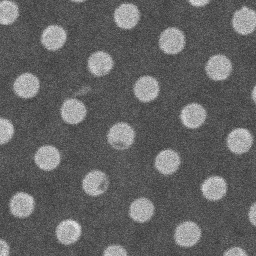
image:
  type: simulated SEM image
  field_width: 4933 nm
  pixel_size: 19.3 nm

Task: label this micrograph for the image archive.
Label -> a regular array of raised bodies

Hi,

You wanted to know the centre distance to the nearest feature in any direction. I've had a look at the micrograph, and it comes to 53.1 pixels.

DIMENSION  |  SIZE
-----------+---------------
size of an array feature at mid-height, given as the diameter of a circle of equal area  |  450 nanometers